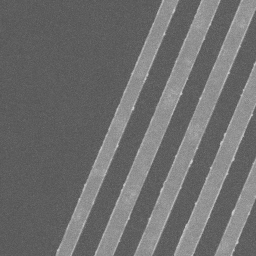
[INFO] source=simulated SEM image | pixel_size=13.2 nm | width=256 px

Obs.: parallel lines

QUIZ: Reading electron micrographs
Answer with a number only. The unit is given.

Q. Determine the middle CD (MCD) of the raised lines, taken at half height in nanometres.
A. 218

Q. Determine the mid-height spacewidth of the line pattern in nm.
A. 269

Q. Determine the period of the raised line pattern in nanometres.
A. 487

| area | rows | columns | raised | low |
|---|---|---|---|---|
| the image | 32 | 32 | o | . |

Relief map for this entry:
....................oo...oo...oo
....................oo...oo...oo
...................oo...ooo..oo.
...................oo...oo...oo.
..................oo...ooo..ooo.
..................oo...oo...oo..
..................oo..ooo..ooo..
.................oo...oo...oo...
.................oo...oo...oo...
................oo...ooo..oo...o
................oo...oo...oo...o
................oo..ooo..ooo..oo
...............oo...oo...oo...oo
...............oo...oo...oo...oo
..............oo...oo...oo...oo.
..............oo...oo...oo...oo.
.............oo...ooo..oo...ooo.
.............oo...oo...oo...oo..
.............oo..ooo..ooo..ooo..
............oo...oo...oo...oo...
............oo...oo...oo...oo...
...........oo...ooo..oo...ooo..o
...........oo...oo...oo...oo...o
..........oo...ooo..ooo..ooo..oo
..........oo...oo...oo...oo...oo
..........oo...oo..ooo..ooo...oo
.........oo...oo...oo...oo...oo.
.........oo...oo...oo...oo...oo.
........oo...ooo..oo...ooo..oo..
........oo...oo...oo...oo...oo..
........oo..ooo..ooo..ooo..ooo..
.......oo...oo...oo...oo...oo...